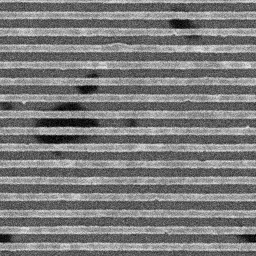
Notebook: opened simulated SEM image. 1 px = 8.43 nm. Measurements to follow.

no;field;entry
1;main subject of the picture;parallel lines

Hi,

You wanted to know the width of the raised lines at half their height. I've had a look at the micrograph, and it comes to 55.8 nanometres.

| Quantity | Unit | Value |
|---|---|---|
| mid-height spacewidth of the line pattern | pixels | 10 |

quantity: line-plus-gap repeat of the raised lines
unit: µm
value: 0.139